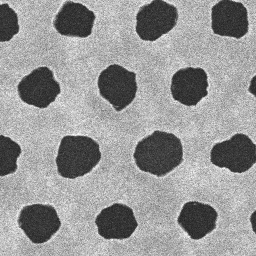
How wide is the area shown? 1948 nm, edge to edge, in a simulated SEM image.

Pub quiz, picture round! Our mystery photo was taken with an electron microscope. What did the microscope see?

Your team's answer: a regular array of holes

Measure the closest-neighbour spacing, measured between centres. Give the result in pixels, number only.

76.2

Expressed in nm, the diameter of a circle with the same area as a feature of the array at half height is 301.